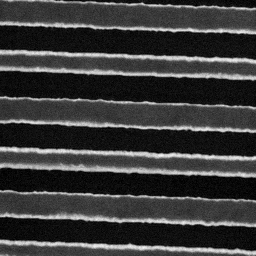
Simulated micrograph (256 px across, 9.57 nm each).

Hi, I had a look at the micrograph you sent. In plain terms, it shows lines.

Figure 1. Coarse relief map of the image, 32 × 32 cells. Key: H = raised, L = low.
HHHHHHHHHHHHHHHLLHLLLLLLLLLLLLLL
HHHHHHHHHHHHHHHHHHHHHHHHHHHHHHHH
HHHHHHHHHHHHHHHHHHHHHHHHHHHHHHHH
LLLLLLLLLLLLHHHHHHHHHHHHHHHHHHHH
LLLLLLLLLLLLLLLLLLLLLLLLLLLLLLLL
LLLLLLLLLLLLLLLLLLLLLLLLLLLLLLLL
HHHHLLLLLLLLLLLLLLLLLLLLLLLLLLLL
HHHHHHHHHHHHHHHHHHHHHHHHHHHHHHHL
HHHHHHHHHHHHHHHHHHHHHHHHHHHHHHHH
LLLLLLLLLLLLLLLLLLLHHHHHHHHHHHHH
LLLLLLLLLLLLLLLLLLLLLLLLLLLLLLLL
LLLLLLLLLLLLLLLLLLLLLLLLLLLLLLLL
HHHHHHHHHHHHHLLLLLLLLLLLLLLLLLLL
HHHHHHHHHHHHHHHHHHHHHHHHHHHHHHHH
HHHHHHHHHHHHHHHHHHHHHHHHHHHHHHHH
LLLLLLLHHHHHHHHHHHHHHHHHHHHHHHHH
LLLLLLLLLLLLLLLLLLLLLLLLLLLLLLLH
LLLLLLLLLLLLLLLLLLLLLLLLLLLLLLLL
LLLLLLLLLLLLLLLLLLLLLLLLLLLLLLLL
HHHHHHHHHHHHHHHHHHHHHHHHHHLLLLLL
HHHHHHHHHHHHHHHHHHHHHHHHHHHHHHHH
LLLLLLLLLLLLLLHHHHHHHHHHHHHHHHHH
LLLLLLLLLLLLLLLLLLLLLLLLLLLLLLLL
LLLLLLLLLLLLLLLLLLLLLLLLLLLLLLLL
HHHHHHHHHHHHHHHHHHHLLLLLLLLLLLLL
HHHHHHHHHHHHHHHHHHHHHHHHHHHHHHHH
HHHHHHHHHHHHHHHHHHHHHHHHHHHHHHHH
LLLLLLLLLLLHHHHHHHHHHHHHHHHHHHHH
LLLLLLLLLLLLLLLLLLLLLLLLLLLLLLLL
LLLLLLLLLLLLLLLLLLLLLLLLLLLLLLLL
HHHHHHHHHLLLLLLLLLLLLLLLLLLLLLLL
HHHHHHHHHHHHHHHHHHHHHHHHHHHHHHHL